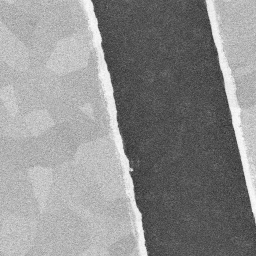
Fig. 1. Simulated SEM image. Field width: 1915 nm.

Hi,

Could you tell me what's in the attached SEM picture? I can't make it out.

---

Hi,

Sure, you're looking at one or a few lines or trenches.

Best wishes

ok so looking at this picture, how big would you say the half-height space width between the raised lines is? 880 nanometers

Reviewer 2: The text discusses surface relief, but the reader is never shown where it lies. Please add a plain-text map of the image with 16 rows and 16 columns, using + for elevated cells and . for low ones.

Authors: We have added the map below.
++++++.......+++
++++++.......+++
++++++........++
++++++........++
+++++++.......++
+++++++.......++
+++++++.......++
+++++++........+
+++++++........+
++++++++.......+
++++++++.......+
++++++++........
++++++++........
+++++++++.......
+++++++++.......
+++++++++.......